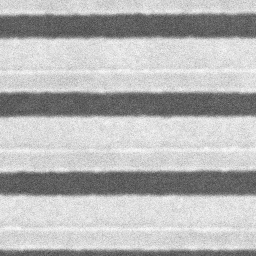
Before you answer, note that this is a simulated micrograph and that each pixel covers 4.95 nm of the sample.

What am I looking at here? lines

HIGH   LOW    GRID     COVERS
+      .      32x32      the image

++++++++++++++++++++++++++++++++
+++++++++++++++++++++++++.++++..
................................
................................
................................
++++++++++++++++++++++++++++++++
++++++++++++++++++++++++++++++++
++++++++++++++++++++++++++++++++
++++++++++++++++++++++++++++++++
++++++++++++++++++++++++++++++++
++++++++++++++++++++++++++++++++
................................
................................
................................
................................
++++++++++++++++++++++++++++++++
++++++++++++++++++++++++++++++++
++++++++++++++++++++++++++++++++
++++++++++++++++++++++++++++++++
++++++++++++++++++++++++++++++++
++++++++++++++++++++++++++++++++
................................
................................
................................
................................
++++++++++++++++++++++++++++++++
++++++++++++++++++++++++++++++++
++++++++++++++++++++++++++++++++
++++++++++++++++++++++++++++++++
++++++++++++++++++++++++++++++++
++++++++++++++++++++++++++++++++
................................